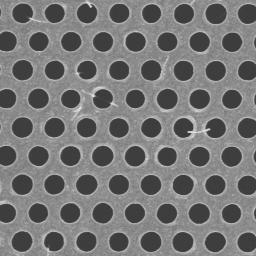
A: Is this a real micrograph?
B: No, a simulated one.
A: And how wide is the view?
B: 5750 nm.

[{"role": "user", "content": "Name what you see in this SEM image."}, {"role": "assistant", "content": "a regular array of holes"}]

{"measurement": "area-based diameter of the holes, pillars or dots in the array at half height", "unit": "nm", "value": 451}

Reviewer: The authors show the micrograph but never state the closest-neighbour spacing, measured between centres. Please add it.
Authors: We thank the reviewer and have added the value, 721 nm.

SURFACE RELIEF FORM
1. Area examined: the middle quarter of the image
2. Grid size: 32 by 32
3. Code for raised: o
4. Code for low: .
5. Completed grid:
oooo....oooo....ooo.....oooo....
ooo.....ooo.....ooo.....ooo.....
oooo....ooo.....ooo.....oooo....
oooo...ooooo...ooooo....oooo....
oooooooooooooooooooooooooooooooo
oooooooooooooooooooooooooooooooo
o.ooooooo..oooooo..oooooo..ooooo
....oooo....oooo....ooo.....oooo
....ooo.....ooo.....ooo.....ooo.
....ooo.....ooo.....ooo.....ooo.
...ooooo....oooo...ooooo....oooo
oooooooooooooooooooooooooooooooo
oooooooooooooooooooooooooooooooo
ooooooooooooooooooooo.ooooooo.oo
oooo....oooo....oooo....oooo....
ooo.....ooo.....ooo.....ooo.....
ooo.....ooo.....ooo.....ooo.....
oooo...ooooo....oooo....oooo....
ooooo.oooooooooooooooooooooooooo
oooooooooooooooooooooooooooooooo
o.ooooooo.oooooooooooooooooooooo
....oooo....oooo....oooo....oooo
....ooo.....ooo.....ooo.....ooo.
....ooo.....ooo.....ooo.....ooo.
....ooo.....oooo....oooo....oooo
o.ooooooo.ooooooo..oooooo.oooooo
oooooooooooooooooooooooooooooooo
oooooooooooooooooooooooooooooooo
oooo....oooo....oooo....oooo....
ooo.....ooo.....ooo.....ooo.....
ooo.....ooo.....ooo.....ooo.....
ooo.....oooo....ooo.....ooo.....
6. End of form